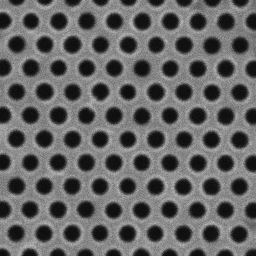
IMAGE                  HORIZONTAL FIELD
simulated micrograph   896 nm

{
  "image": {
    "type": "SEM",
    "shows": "a regular array of holes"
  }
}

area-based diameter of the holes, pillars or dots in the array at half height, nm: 57.3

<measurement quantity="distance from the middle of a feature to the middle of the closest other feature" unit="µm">0.0949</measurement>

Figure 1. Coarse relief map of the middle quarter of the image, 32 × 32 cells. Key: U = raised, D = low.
DUUUDDDDUUUDDDUUUUDDDUUUUDDDDUUD
DUUUDDDDUUUDDDUUUDDDDDUUUDDDDUUD
UUUUDDDUUUUDDDUUUUDDDUUUUDDDUUUU
UUUUUUUUUUUUUUUUUUUUUUUUUUUUUUUU
UUUUUUUUUUUUUUUUUUUUUUUUUUUUUUUU
UDDUUUUUDDDUUUUDDUUUUUDDUUUUUDDU
DDDDUUUDDDDUUUDDDDUUUDDDDUUUDDDD
DDDDUUUDDDDUUUDDDDUUUDDDDUUUDDDD
UDDUUUUUDDUUUUUDDUUUUUDDUUUUUDDU
UUUUUUUUUUUUUUUUUUUUUUUUUUUUUUUU
UUUUUUUUUUUUUUUUUUUUUUUUUUUUUUUU
UUUUDDDUUUUDDDUUUUDDDUUUUDDDUUUU
DUUUDDDUUUUDDDDUUUDDDUUUDDDDDUUD
DUUUDDDUUUUDDDUUUUDDDDUUDDDDDUUD
UUUUDDDUUUUDDDUUUUDDDUUUUDDDUUUU
UUUUUUUUUUUUUUUUUUUUUUUUUUUUUUUU
UUUUUUUUUUUUUUUUUUUUUUUUUUUUUUUU
UDDDUUUUDDDUUUUDDDUUUDDDDUUUUDDU
DDDDUUUDDDDUUUDDDDUUUDDDDUUUDDDD
DDDDUUUDDDDUUUDDDDUUUDDDDUUUDDDD
UDDUUUUUDDUUUUUDDUUUUUDDUUUUUDDU
UUUUUUUUUUUUUUUUUUUUUUUUUUUUUUUU
UUUUUUUUUUUUUUUUUUUUUUUUUUUUUUUU
UUUUDDDUUUUDDDUUUUDDDUUUUDDDUUUU
DUUUDDDDUUUDDDDUUDDDDDUUDDDDDUUU
UUUUDDDUUUUDDDUUUDDDDUUUDDDDUUUU
UUUUUDUUUUUDDUUUUUDDUUUUUUDDUUUU
UUUUUUUUUUUUUUUUUUUUUUUUUUUUUUUU
UUUUUUUUUUUUUUUUUUUUUUUUUUUUUUUU
DDDDUUUDDDDUUUDDDDUUUDDDDUUUDDDD
DDDDUUUDDDDUUUDDDDUUUDDDDUUUDDDD
DDDDUUUDDDDUUUDDDDUUUDDDDUUUDDDD